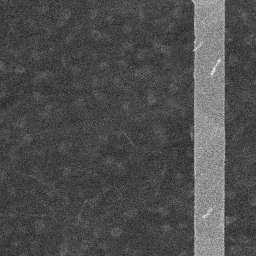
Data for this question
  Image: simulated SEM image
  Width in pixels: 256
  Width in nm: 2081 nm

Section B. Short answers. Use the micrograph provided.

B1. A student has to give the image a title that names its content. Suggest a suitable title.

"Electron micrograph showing one or a few lines or trenches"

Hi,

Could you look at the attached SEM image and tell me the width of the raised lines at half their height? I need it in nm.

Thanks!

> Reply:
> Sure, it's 240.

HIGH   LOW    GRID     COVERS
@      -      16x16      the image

------------@@--
------------@@--
------------@@--
------------@@--
------------@@--
------------@@--
------------@@--
------------@@--
------------@@--
------------@@--
------------@@--
------------@@--
------------@@--
------------@@--
------------@@--
------------@@--